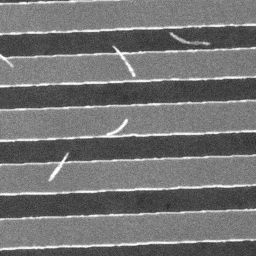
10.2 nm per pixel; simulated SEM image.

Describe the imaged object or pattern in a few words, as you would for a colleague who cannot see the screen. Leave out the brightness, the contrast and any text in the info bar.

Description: lines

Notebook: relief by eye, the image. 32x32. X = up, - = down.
XXXXXXXXXXXXXXXXXXXXXXXXXXXXXXXX
XXXXXXXXXXXXXXXXXXXXXXXXXXXXXXXX
XXXXXXXXXXXXXXXXXXXXXXXXXXXXXXXX
XXXXXXXXXXXXXXXXXXXXX-----------
--------------------------------
--------------------------------
--------------------XXXXXXXXXXXX
XXXXXXXXXXXXXXXXXXXXXXXXXXXXXXXX
XXXXXXXXXXXXXXXXXXXXXXXXXXXXXXXX
XXXXXXXXXXXXXXXXXXXXXXXXXXXXXXXX
XXXXXX--------------------------
--------------------------------
--------------------------------
--------XXXXXXXXXXXXXXXXXXXXXXXX
XXXXXXXXXXXXXXXXXXXXXXXXXXXXXXXX
XXXXXXXXXXXXXXXXXXXXXXXXXXXXXXXX
XXXXXXXXXXXXXXXXXXXXXXXXXXXXX---
XXXXX---------------------------
--------------------------------
----------------------------XXXX
---XXXXXXXXXXXXXXXXXXXXXXXXXXXXX
XXXXXXXXXXXXXXXXXXXXXXXXXXXXXXXX
XXXXXXXXXXXXXXXXXXXXXXXXXXXXXXXX
XXXXXXXXXXXXXXXXXXXXXX----------
--------------------------------
--------------------------------
-------------------------XXXXXXX
XXXXXXXXXXXXXXXXXXXXXXXXXXXXXXXX
XXXXXXXXXXXXXXXXXXXXXXXXXXXXXXXX
XXXXXXXXXXXXXXXXXXXXXXXXXXXXXXXX
XXXXXXXXXXXXXXXXX---------------
--------------------------------